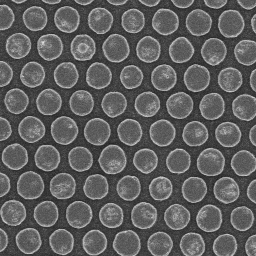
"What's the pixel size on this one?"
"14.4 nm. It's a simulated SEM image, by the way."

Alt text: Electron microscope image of a regular array of raised bodies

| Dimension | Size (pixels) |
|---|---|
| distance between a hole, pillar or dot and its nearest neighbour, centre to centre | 31.9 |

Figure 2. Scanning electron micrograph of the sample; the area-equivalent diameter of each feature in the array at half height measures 365 nm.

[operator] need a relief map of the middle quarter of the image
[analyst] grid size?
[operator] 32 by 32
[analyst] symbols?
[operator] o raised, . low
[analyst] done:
ooo....oooo.....oo......oo......
ooo...oooooo...oooo...ooooo....o
ooo...oooooo..oooooo..oooooo..oo
ooo...oooooo..oooooo..oooooo..oo
ooo...ooooo...ooooo...oooooo..oo
oo.....oooo....oooo....oooo....o
.........................o.....o
..oooo.....ooo.....oooo....ooo..
..ooooo...ooooo...ooooo...oooooo
..ooooo...ooooo...oooooo..oooooo
..ooooo...ooooo...oooooo..oooooo
..ooooo...ooooo...oooooo..oooooo
...ooo.....ooo.....oooo...ooooo.
o...........................oo..
ooo...oooo....oooo.....ooo......
ooo...ooooo...ooooo...ooooo...oo
ooo..oooooo...ooooo...oooooo..oo
ooo..oooooo...ooooo...oooooo..oo
ooo..oooooo...ooooo...ooooo...oo
oo....oooo.....ooo....ooooo....o
...........oo...........o.......
..oooo....oooo.....ooo......oo..
.oooooo..oooooo...ooooo....oooo.
.oooooo..oooooo...ooooo...ooooo.
.oooooo..ooooooo.oooooo...ooooo.
..ooooo..oooooo...ooooo...ooooo.
...ooo....ooooo....ooo....ooooo.
o...............................
oo....oooo.....ooo.....oo.......
ooo..oooooo...ooooo...ooooo...oo
ooo..oooooo..oooooo..oooooo...oo
oo...oooooo..oooooo..oooooo...oo